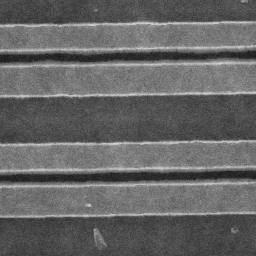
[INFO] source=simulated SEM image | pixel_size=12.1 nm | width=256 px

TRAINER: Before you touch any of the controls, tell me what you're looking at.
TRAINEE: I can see lines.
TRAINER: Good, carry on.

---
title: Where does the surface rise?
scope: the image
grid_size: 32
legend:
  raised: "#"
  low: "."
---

................................
................................
................................
################################
################################
################################
######..#####...................
................................
################################
################################
################################
################################
................................
................................
................................
................................
................................
................................
################################
################################
################################
###.....#.......................
................................
################################
################################
################################
################################
................................
................................
................................
................................
................................